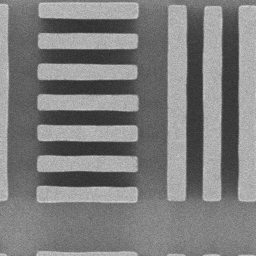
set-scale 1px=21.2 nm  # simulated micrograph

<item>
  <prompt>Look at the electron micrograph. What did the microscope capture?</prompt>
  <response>groups of lines, slits or small figures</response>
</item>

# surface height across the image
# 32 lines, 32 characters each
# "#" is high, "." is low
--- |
.....############...............
#....############....##...##..##
#....................##...##..##
#....................##...##..##
#....############....##...##..##
#....############....##..###..##
#....................##..###..##
#....................##..###..##
#....############....##..###..##
#....############....##..###..##
#....................##..###..##
#....................##..###..##
#....############....##..###..##
#....############....##..###..##
#....................##..###..##
#....................##..###..##
#....############....##..###..##
#....############....##..###..##
#....................##..###..##
#....###..#####......##..###..##
#....############....##..###..##
#....................##..###..##
#....................##..###..##
#....############....##..###..##
#....############....##..###..##
................................
................................
................................
................................
................................
................................
................................